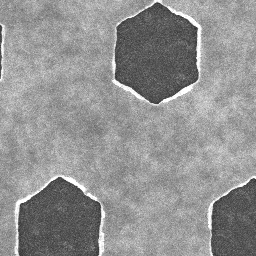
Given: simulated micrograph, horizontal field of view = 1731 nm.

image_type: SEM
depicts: holes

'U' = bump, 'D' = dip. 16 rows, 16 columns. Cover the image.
UUUUUUUUUDUUUUUU
UUUUUUUUDDDDUUUU
UUUUUUUDDDDDUUUU
UUUUUUUDDDDDUUUU
UUUUUUUDDDDDUUUU
UUUUUUUUDDDDUUUU
UUUUUUUUUUUUUUUU
UUUUUUUUUUUUUUUU
UUUUUUUUUUUUUUUU
UUUUUUUUUUUUUUUU
UUUUUUUUUUUUUUUU
UUUDDUUUUUUUUUUD
UUDDDDUUUUUUUUDD
UDDDDDUUUUUUUDDD
UDDDDDUUUUUUUDDD
UDDDDDUUUUUUUDDD